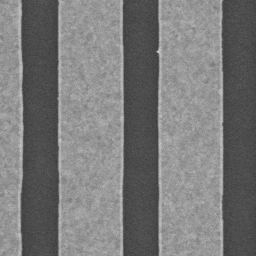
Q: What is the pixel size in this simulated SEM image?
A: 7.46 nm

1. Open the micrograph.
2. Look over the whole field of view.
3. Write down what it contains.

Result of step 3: one or a few lines or trenches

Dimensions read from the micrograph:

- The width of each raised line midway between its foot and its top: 62.6 px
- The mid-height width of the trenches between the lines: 37.9 pixels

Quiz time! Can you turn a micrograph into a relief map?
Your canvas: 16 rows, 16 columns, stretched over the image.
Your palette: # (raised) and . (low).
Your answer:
#...####..####..
#...####..####..
#...####..####..
#...####..####..
#...####..####..
#...####..####..
#...####..####..
#...####..####..
#...####..####..
#...####..####..
#...####..####..
#...####..####..
#...####..####..
#...####..####..
#...####..####..
#...####..####..